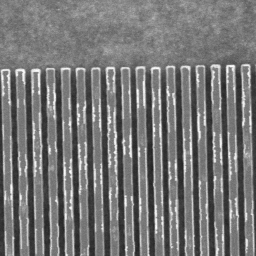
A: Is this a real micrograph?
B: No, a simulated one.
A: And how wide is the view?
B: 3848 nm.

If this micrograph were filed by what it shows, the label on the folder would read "parallel lines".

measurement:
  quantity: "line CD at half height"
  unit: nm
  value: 135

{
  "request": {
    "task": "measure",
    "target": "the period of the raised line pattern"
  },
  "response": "226 nm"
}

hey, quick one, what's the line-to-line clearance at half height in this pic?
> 6.37 px